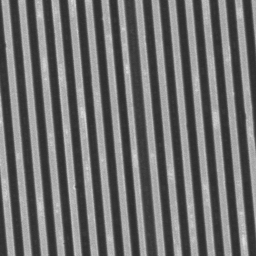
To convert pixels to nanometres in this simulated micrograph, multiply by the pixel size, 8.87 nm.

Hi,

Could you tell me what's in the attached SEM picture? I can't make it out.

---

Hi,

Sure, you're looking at parallel lines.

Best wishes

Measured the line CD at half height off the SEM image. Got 8.46 px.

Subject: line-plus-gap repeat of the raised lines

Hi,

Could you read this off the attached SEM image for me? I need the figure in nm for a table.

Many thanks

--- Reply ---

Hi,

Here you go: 147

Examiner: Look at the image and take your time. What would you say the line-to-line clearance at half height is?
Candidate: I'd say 73.9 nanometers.